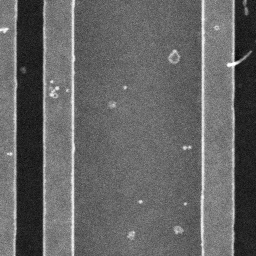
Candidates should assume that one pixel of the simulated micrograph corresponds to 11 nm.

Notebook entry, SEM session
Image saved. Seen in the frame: lines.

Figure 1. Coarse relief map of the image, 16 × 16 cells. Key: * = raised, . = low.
*..**........**.
*..**........**.
*..**........**.
*..**........**.
*..**........**.
*..**........**.
*..**........**.
*..**........**.
*..**........**.
*..**........**.
*..**........**.
*..**........**.
*..**........**.
*..**........**.
*..**........**.
*..**........**.